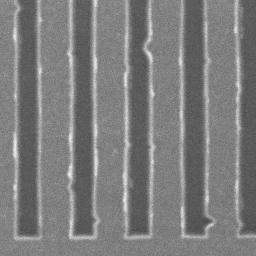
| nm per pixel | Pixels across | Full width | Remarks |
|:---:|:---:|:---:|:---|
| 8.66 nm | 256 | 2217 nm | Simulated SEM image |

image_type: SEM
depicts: parallel lines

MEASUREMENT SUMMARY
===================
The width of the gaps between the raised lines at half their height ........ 203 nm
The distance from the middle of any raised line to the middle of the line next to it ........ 481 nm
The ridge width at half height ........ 0.278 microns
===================